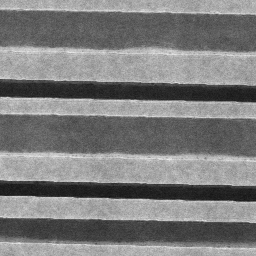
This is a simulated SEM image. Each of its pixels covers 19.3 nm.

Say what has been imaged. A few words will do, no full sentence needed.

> lines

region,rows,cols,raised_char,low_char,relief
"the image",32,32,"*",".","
********************************
....................************
................................
................................
................................
................................
****............................
********************************
********************************
********************************
........................********
................................
************....................
********************************
..................**************
................................
................................
................................
................................
******..........................
********************************
********************************
********************************
................................
................................
********************************
********************************
..................**************
................................
................................
*********.......................
********************************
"